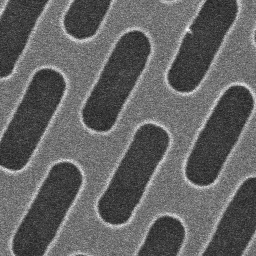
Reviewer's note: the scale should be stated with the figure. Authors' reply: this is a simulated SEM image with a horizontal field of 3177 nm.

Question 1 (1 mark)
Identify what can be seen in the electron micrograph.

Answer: holes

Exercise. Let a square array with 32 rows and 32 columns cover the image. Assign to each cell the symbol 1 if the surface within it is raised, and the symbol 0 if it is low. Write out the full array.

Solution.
10000011100000111111111110000011
00000111000001111111111110000011
00000111000001111111111100000111
00001111000011111111111100000111
00001111100011100011111000001111
00011111111111100001111000001111
00011111111111000001110000011111
00111111111110000011110000011111
00111111111110000011100000111111
01110000111100000011100000111111
11110000111100000111100001111111
11100000111000000111110011110001
11100000111000001111111111100000
11000001110000011111111111100000
11000001110000011111111111000001
10000011111000111101111111000001
10000011111101111000011110000011
00000111111111110000011100000011
00001111111111110000011100000111
00001111111111100000011100000111
00011110011111100000111000001111
11111100001111000001111000001111
11111100001111000001111000011110
11111000001110000011111111111100
11110000001110000011111111111000
11110000011100000111111111111000
11100000111100000111111111110000
11100000111110001110001111100000
11000001111111111110000111100000
11000001111111111100000111100000
10000011111111111100000111000001
11000011111111111000001110000001